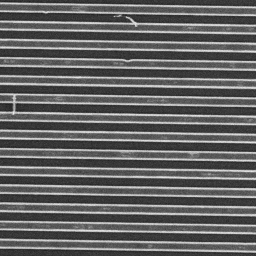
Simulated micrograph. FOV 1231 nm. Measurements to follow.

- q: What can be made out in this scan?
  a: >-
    parallel lines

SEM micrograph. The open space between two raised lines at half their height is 48.7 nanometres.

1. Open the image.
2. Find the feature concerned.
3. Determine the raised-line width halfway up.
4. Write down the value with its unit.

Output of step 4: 40.3 nanometers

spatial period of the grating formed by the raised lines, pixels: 18.2